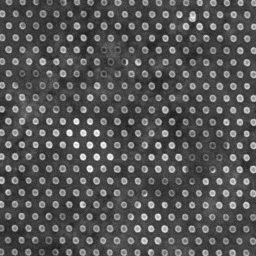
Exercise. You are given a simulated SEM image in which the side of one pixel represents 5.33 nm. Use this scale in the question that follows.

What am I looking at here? a regular array of raised bodies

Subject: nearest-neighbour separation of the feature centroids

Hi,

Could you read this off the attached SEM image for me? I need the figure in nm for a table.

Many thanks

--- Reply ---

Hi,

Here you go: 71.3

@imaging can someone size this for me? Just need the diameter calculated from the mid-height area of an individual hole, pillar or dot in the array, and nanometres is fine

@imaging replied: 31.8